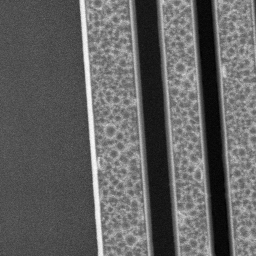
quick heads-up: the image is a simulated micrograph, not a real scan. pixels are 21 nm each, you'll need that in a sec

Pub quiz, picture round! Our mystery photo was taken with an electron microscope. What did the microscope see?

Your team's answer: one or a few lines or trenches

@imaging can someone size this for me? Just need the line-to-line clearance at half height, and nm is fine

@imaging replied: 485